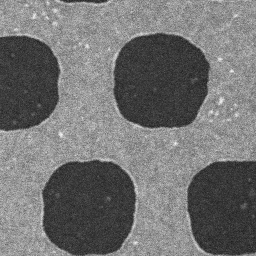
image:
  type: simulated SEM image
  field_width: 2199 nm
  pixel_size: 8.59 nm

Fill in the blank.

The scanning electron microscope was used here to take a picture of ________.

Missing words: holes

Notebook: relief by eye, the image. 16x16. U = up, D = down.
UUUUUUUUUUUUUUUU
UUUUUUUUUUUUUUUU
DDUUUUUUDDDDUUUU
DDDUUUUDDDDDDUUU
DDDDUUUDDDDDDUUU
DDDDUUUDDDDDDUUU
DDDDUUUDDDDDDUUU
DDDUUUUUDDDDUUUU
UUUUUUUUUUUUUUUU
UUUUUUUUUUUUUUUU
UUUUDDDDUUUUUDDD
UUUDDDDDUUUUDDDD
UUUDDDDDDUUUDDDD
UUUDDDDDUUUUDDDD
UUUDDDDDUUUUDDDD
UUUUDDDUUUUUDDDD